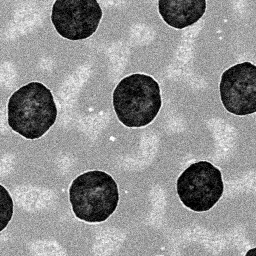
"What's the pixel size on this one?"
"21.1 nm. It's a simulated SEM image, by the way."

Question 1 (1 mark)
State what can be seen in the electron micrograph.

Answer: holes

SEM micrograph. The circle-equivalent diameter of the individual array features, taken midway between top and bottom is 1080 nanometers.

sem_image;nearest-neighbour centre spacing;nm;2220